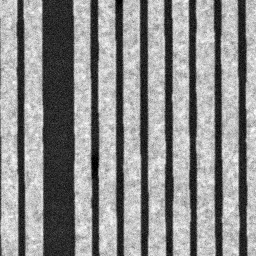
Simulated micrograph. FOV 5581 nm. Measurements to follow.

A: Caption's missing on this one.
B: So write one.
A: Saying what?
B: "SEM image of wiring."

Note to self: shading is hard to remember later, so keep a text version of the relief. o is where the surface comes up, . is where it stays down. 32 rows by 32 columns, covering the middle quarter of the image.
...ooo...oooo..oooo..oooo..oooo.
...ooo...oooo..oooo..oooo..oooo.
...ooo...oooo..oooo..oooo..oooo.
...oooo..oooo..oooo..oooo..oooo.
...oooo..oooo..oooo..oooo..oooo.
...oooo..oooo..oooo..oooo..oooo.
...oooo..oooo..oooo..oooo..oooo.
...oooo..oooo..oooo..oooo..oooo.
...oooo..oooo..oooo..oooo..oooo.
...oooo..oooo..oooo..oooo..oooo.
...oooo..oooo..oooo..oooo..oooo.
...oooo..oooo..oooo..oooo..oooo.
...oooo..oooo..oooo..oooo..oooo.
...oooo..oooo..oooo..oooo..oooo.
...oooo..oooo..oooo..oooo..oooo.
...oooo..oooo..oooo..oooo..oooo.
...oooo..oooo..oooo..oooo..oooo.
...oooo..oooo..oooo..oooo..oooo.
...oooo..oooo..oooo..oooo..oooo.
...oooo..oooo..oooo..oooo..oooo.
...oooo..oooo..oooo..oooo..oooo.
...oooo..oooo..oooo..oooo..oooo.
...oooo..oooo..oooo..oooo..oooo.
...oooo..oooo..oooo..oooo..oooo.
...oooo..oooo..oooo..oooo..oooo.
...oooo..oooo..oooo..oooo..oooo.
...oooo..oooo..oooo..oooo..oooo.
...oooo..oooo..oooo..oooo..oooo.
...oooo..oooo..oooo..oooo...ooo.
...oooo..oooo..oooo..oooo...ooo.
...oooo..oooo..oooo..oooo...ooo.
...oooo..oooo..oooo..oooo...ooo.